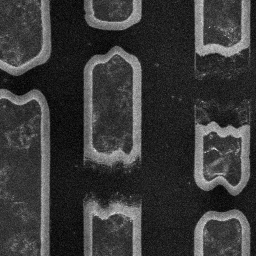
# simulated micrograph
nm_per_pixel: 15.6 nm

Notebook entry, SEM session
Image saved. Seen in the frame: one or a few lines or trenches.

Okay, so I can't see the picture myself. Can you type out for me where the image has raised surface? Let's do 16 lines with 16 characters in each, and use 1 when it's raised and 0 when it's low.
1110001110000110
1110001100000110
1110000000000110
1110000100000000
0000001110000000
0000001110000000
1110001110000000
1110001110000000
1110001110000110
1110001100001110
1110000000001110
1110000000000010
1110000000000000
1110001100000010
1110001110001110
1110001110001110